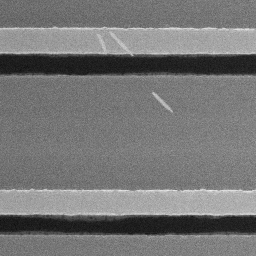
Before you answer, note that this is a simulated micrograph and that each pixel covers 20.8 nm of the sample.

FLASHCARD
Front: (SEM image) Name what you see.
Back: lines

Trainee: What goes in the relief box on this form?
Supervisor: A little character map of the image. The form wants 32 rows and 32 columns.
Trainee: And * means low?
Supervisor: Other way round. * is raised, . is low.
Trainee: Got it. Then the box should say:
********************************
********************************
********************************
********************************
********************************
********************************
********************************
................................
................................
.*.***.*........*.****....***...
********************************
********************************
********************************
********************************
********************************
********************************
********************************
********************************
********************************
********************************
********************************
********************************
********************************
********************************
********************************
********************************
********************************
................................
................................
********************************
********************************
********************************